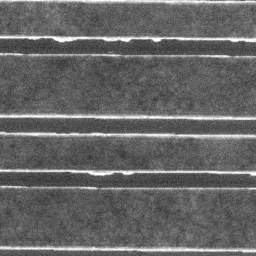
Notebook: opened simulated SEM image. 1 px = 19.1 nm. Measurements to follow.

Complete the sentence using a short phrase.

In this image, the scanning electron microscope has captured lines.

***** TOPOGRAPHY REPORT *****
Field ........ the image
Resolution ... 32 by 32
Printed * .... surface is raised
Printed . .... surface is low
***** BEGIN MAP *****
********************************
********************************
********************************
********************************
********************************
................................
................................
********************************
********************************
********************************
********************************
********************************
********************************
********************************
........************************
................................
................................
********************************
********************************
********************************
********************************
.............................***
................................
************....................
********************************
********************************
********************************
********************************
********************************
********************************
********************************
................................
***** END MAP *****